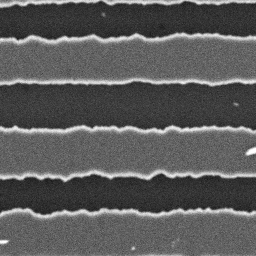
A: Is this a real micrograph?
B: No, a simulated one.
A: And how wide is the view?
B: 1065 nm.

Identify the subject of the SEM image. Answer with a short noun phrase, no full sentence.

lines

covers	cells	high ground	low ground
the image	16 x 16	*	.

................
................
****************
****************
****************
................
................
................
****************
****************
****************
................
................
****************
****************
****************